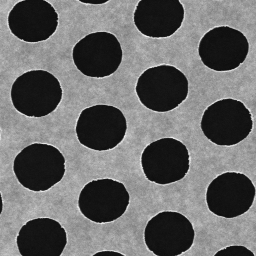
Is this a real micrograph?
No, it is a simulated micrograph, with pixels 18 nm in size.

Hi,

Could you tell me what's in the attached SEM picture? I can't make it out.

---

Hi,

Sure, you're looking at a regular array of holes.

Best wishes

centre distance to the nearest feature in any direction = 1310 nm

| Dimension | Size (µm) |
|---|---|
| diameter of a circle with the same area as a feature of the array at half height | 0.865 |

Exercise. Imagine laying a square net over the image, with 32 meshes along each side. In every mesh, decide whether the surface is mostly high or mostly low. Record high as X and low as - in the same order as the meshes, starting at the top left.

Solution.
XX----XXXXXXXXXXX------XXXXXXXXX
X------XXXXXXXXXX------XXXXXXXXX
X------XXXXXXXXXX------XXXXXXXXX
X------XXXXXXXXXX-----XXXXX--XXX
XX----XXXXX---XXXX---XXXX------X
XXXXXXXXXX-----XXXXXXXXXX------X
XXXXXXXXX------XXXXXXXXXX------X
XXXXXXXXX------XXXXXXXXXX------X
XXXXXXXXXX-----XXXX---XXXX---XXX
XXX----XXXX--XXXXX-----XXXXXXXXX
XX-----XXXXXXXXXX------XXXXXXXXX
X-------XXXXXXXXX------XXXXXXXXX
XX------XXXXXXXXXX-----XXXXX--XX
XX-----XXXX----XXXX---XXXX-----X
XXXX-XXXXX------XXXXXXXXX------X
XXXXXXXXXX------XXXXXXXXX-------
XXXXXXXXXX------XXXXXXXXX------X
XXXXXXXXXX-----XXXXX--XXXX----XX
XXX----XXXX---XXXX-----XXXXXXXXX
XX------XXXXXXXXXX------XXXXXXXX
XX------XXXXXXXXXX------XXXXXXXX
XX------XXXXXXXXXX-----XXXXXXXXX
XX------XXXX--XXXXX---XXXXX----X
XXX---XXXX------XXXXXXXXXX------
XXXXXXXXXX------XXXXXXXXXX------
XXXXXXXXXX------XXXXXXXXXX-----X
XXXXXXXXXX------XXXX--XXXXX----X
XXXX---XXXX---XXXXX-----XXXXXXXX
XXX-----XXXXXXXXXX------XXXXXXXX
XX------XXXXXXXXXX------XXXXXXXX
XX------XXXXXXXXXX------XXXXXXXX
XX------XXXX--XXXXX----XXXX----X